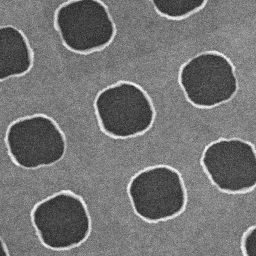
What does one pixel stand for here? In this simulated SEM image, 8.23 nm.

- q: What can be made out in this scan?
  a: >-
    holes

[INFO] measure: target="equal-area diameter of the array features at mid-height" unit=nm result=439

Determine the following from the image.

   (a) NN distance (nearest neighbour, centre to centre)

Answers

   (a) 0.736 um